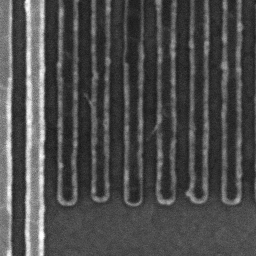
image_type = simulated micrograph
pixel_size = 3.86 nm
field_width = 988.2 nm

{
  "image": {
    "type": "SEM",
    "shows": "parallel lines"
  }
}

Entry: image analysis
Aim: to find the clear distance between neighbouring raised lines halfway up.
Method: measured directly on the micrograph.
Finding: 15.1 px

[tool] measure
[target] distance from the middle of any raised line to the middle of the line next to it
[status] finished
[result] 126 nm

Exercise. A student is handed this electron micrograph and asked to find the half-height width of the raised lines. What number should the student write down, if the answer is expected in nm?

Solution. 68